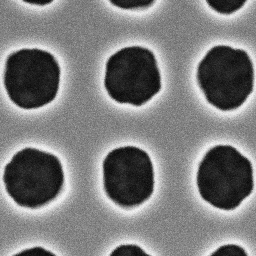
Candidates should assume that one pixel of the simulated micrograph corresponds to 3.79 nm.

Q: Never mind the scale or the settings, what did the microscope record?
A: holes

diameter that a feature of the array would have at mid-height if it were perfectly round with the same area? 228 nanometres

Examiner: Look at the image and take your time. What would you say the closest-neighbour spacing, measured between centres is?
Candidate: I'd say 359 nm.